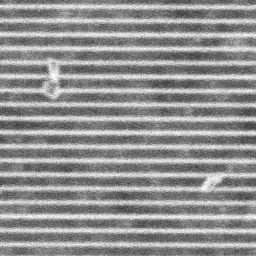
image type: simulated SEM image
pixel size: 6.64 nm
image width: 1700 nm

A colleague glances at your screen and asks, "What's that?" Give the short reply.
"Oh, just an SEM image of parallel lines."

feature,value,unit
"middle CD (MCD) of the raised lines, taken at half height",2.88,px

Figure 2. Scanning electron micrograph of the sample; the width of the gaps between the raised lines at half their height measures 78 nanometers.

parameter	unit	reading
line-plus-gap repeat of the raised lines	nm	92.8